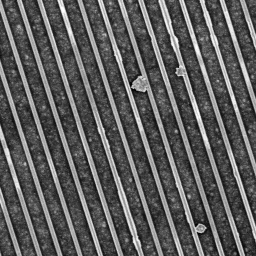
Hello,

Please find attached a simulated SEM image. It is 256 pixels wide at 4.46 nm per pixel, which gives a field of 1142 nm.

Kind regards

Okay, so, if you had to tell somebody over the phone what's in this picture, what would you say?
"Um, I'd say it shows parallel lines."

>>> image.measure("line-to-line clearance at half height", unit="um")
0.0675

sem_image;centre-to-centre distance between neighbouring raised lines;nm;86.3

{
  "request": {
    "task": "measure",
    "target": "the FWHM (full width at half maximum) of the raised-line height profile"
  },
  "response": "0.0196 microns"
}